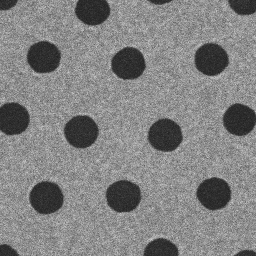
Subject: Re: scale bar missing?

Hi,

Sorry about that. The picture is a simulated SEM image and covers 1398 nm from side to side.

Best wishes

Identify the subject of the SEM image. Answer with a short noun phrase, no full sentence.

a regular array of holes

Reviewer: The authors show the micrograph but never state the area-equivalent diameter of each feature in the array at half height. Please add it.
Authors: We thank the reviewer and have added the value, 181 nanometers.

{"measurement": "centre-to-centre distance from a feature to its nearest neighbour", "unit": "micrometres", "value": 0.411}